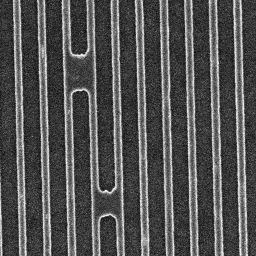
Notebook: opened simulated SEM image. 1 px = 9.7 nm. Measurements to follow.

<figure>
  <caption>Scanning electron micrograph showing parallel lines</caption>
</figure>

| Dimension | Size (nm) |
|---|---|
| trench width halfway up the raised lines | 167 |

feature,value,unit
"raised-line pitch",24.5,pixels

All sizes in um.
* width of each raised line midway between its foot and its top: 0.0667